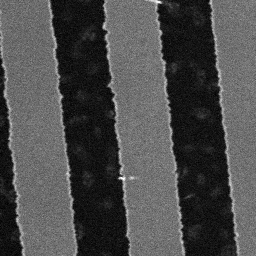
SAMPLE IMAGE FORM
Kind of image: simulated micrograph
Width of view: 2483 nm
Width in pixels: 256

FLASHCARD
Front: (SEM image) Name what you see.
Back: one or a few lines or trenches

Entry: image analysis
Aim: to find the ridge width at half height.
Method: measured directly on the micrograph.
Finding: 516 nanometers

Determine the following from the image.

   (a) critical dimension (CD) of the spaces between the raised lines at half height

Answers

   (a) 518 nanometers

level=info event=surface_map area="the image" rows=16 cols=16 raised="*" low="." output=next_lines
***....***...***
***....***...***
***....***...***
***....***....**
****...***....**
****...***....**
****...***....**
.***...****...**
.***...****...**
.***...****...**
.***....***...**
.***....***...**
.***....***....*
.****...***....*
.****...***....*
.****...***....*